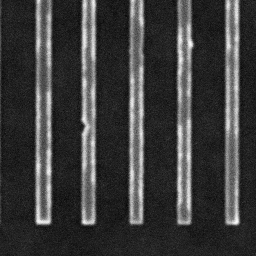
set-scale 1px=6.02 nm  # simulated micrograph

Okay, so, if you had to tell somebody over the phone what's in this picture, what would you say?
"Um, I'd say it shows parallel lines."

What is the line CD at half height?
0.0737 microns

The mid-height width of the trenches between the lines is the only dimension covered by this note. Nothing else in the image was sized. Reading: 217 nm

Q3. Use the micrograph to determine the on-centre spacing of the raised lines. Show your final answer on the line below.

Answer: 284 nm